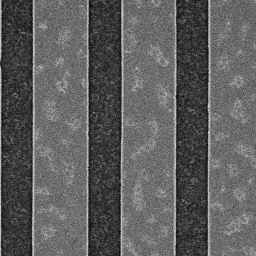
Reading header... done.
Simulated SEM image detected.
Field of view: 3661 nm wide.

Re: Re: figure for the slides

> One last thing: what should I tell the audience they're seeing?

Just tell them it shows one or a few lines or trenches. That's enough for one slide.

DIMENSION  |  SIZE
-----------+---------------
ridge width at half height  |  774 nm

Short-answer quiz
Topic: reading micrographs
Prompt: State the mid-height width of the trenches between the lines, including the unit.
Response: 483 nm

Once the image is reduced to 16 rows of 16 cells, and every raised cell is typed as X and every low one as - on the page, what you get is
--XXX---XXX--XXX
--XXX---XXX--XXX
--XXX---XXX--XXX
--XXX---XXX--XXX
--XXX---XXX--XXX
--XXX---XXX--XXX
--XXX---XXX--XXX
--XXX---XXX--XXX
--XXX---XXX--XXX
--XXX---XXX--XXX
--XXX---XXX--XXX
--XXX---XXX--XXX
--XXX---XXX--XXX
--XXX---XXX--XXX
--XXX---XXX--XXX
--XXX---XXX--XXX